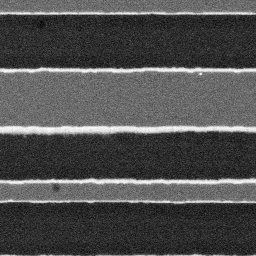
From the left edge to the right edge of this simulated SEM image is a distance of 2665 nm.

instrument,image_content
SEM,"lines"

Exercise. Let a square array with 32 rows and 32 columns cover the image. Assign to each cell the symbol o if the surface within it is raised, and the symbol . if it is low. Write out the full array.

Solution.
oooooooooooooooooooooooooooooooo
oooooooooooooooooooooooooooooooo
................................
................................
................................
................................
................................
................................
................................
oooooooooooooooooooooooooooooooo
oooooooooooooooooooooooooooooooo
oooooooooooooooooooooooooooooooo
oooooooooooooooooooooooooooooooo
oooooooooooooooooooooooooooooooo
oooooooooooooooooooooooooooooooo
oooooooooooooooooooooooooooooooo
................................
................................
................................
................................
................................
................................
................................
oooooooooooooooooooooooooooooooo
oooooooooooooooooooooooooooooooo
................................
................................
................................
................................
................................
................................
................................